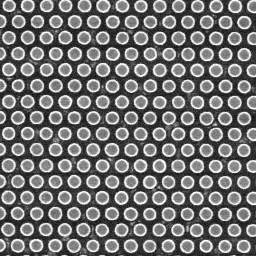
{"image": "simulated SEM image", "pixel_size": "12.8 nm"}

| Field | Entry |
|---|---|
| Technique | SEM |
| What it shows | a regular array of raised bodies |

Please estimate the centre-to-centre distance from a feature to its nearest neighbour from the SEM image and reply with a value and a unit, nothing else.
234 nanometers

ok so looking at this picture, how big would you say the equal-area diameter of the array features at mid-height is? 158 nm